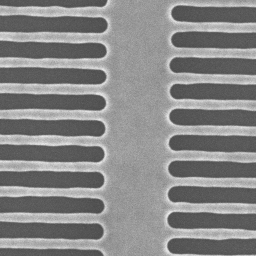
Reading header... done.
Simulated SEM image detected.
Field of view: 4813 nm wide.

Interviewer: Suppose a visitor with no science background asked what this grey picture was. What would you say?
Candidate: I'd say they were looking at groups of lines, slits or small figures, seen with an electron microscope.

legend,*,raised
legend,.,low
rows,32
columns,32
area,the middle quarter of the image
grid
**************************......
.........******************.....
...........*********************
...........*********************
..........**********************
***************************.....
**************************......
.****..*******************......
..........*****************.....
...........*********************
...........*********************
..........*****************.....
**************************......
**************************......
..........*****************.....
..........*******************...
..........**********************
..........*******************...
***************************.....
**************************......
.........*****************......
..........*****************.....
..........**********************
..........**********************
.........******************.....
**************************......
**************************......
.........******************.....
..........*******************.**
..........**********************
..........******************....
**************************......